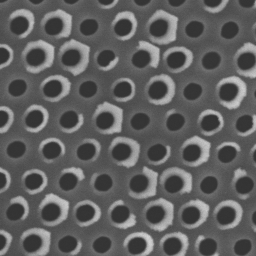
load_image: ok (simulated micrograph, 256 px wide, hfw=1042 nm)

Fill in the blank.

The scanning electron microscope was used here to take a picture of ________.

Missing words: a regular array of holes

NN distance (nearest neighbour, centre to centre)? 142 nm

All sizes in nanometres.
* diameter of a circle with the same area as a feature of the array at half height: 69.9